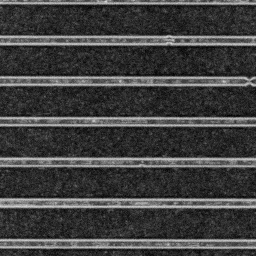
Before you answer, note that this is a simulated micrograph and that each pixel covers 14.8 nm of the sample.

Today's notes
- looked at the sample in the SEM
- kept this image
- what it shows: parallel lines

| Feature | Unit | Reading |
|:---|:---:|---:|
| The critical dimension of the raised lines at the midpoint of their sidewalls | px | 8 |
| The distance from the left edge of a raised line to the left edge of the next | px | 40.7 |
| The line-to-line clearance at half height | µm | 0.487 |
